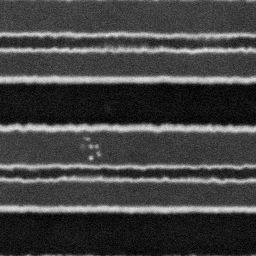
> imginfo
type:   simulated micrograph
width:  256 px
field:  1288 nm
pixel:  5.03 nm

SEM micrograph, lines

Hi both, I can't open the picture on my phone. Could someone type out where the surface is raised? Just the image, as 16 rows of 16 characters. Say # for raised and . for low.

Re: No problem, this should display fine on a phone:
################
################
################
################
################
................
................
................
################
################
################
################
################
................
................
................